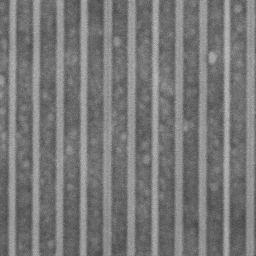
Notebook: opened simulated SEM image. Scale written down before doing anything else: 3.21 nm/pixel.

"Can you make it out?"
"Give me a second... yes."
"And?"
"parallel lines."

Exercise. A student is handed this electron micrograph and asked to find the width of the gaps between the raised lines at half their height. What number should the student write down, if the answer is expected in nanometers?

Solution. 57.3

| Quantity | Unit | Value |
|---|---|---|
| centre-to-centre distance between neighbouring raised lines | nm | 76.4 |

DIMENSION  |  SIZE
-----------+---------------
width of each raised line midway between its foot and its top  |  21.6 nanometres